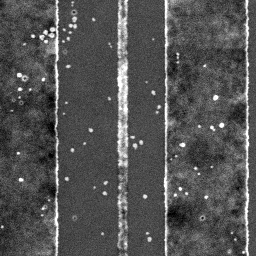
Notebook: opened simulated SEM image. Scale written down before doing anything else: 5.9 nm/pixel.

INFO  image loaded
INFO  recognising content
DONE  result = lines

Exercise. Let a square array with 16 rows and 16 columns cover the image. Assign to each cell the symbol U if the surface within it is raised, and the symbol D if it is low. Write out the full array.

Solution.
UUUUDDDDDDUUUUUD
UUUUDDDDDDUUUUUD
UUUUDDDDDDUUUUUD
UUUUDDDDDDUUUUUD
UUUUDDDDDDUUUUUD
UUUUDDDDDDUUUUUD
UUUUDDDDDDUUUUUD
UUUUDDDDDDUUUUUD
UUUUDDDDDDUUUUUD
UUUUDDDDDDUUUUUD
UUUUDDDDDDUUUUUD
UUUUDDDDDDUUUUUD
UUUUDDDDDDUUUUUD
UUUUDDDDDDUUUUUD
UUUUDDDDDDUUUUUD
UUUUDDDDDDUUUUUD